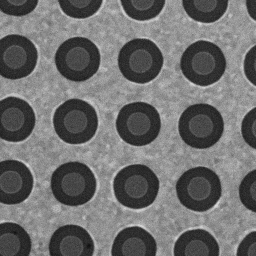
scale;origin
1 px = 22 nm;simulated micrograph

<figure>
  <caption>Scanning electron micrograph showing an array of small figures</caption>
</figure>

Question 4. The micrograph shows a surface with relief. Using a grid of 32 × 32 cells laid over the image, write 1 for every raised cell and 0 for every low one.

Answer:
00000110000001100000011000000110
00001111000011100000111000001110
11111111111111111001111100011111
11111111111111111111111111111111
10011111111111111111111111111111
00001111000011110000111100011111
00000110000001100000111000001110
00000110000001100000111000001100
00001110000011100000111000001100
00001111000011100000111000001110
11111111111111111011111100011110
11111111111111111111111111111111
00011111000111111111111111111111
00001110000011100001111000011111
00001110000011100000110000001110
00001110000011000000110000001100
00001110000011100000110000001100
00011111000111100001111000011110
11111111111111111111111100111111
11111111111111111111111111111111
00011111000111111111111111111111
00001110000011100001111000011110
00001100000011000000110000011100
00001100000011000000110000001100
00001110000011000000110000001100
00111111000111100001111000011100
11111111111111111111111100111111
11111111111111111111111111111111
00011110000111100011111100111111
00001100000111000001110000011100
00001100000011000000110000011100
00001100000011000000110000001000